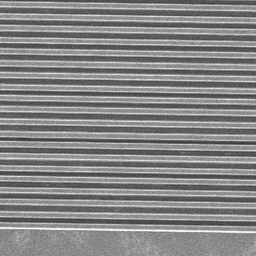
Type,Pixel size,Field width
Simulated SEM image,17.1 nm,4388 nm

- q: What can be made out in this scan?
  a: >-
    parallel lines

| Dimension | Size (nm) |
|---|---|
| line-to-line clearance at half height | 105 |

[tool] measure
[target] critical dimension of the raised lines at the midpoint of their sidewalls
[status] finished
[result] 105 nanometers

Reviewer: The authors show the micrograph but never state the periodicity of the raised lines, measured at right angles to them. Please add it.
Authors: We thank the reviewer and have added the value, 199 nm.